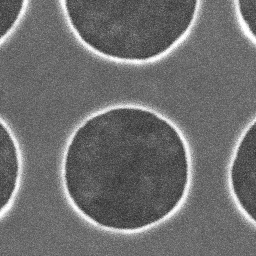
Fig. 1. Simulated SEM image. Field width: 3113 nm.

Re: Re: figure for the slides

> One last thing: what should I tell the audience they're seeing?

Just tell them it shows holes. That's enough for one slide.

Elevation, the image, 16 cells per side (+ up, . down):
.+++........+++.
.+++........+++.
+++++......+++++
+++++++...++++++
++++++++++++++++
++++++++++++++++
++++++++++++++++
++++++....++++++
.++++......++++.
.+++........+++.
.+++........+++.
.+++........++..
.++++......++++.
+++++.....++++++
++++++++++++++++
++++++++++++++++